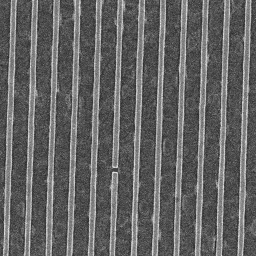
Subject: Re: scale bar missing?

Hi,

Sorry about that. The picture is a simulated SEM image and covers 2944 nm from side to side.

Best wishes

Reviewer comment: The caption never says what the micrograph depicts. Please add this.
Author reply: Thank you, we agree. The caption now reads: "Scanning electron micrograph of parallel lines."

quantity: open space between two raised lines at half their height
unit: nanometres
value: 182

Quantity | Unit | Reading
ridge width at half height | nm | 60.3